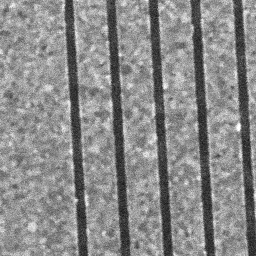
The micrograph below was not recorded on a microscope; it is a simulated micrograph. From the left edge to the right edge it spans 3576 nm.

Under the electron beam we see parallel lines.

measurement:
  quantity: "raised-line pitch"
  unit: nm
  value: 590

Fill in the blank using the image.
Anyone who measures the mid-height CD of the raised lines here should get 439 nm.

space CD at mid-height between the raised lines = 0.153 microns